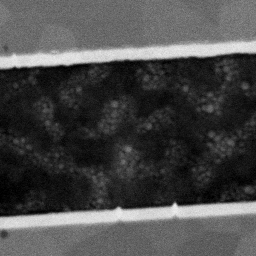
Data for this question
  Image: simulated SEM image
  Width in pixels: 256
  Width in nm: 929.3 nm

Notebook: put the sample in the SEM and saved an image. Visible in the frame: one or a few lines or trenches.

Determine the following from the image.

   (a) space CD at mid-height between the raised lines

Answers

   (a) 161 pixels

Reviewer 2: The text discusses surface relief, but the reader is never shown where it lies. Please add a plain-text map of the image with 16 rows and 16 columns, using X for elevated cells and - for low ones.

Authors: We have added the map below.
XXXXXXXXXXXXXXXX
XXXXXXXXXXXXXXXX
XXXXXXXXXXXXXXXX
XXXXXX----------
----------------
----------------
----------------
----------------
----------------
----------------
----------------
----------------
----------------
-------XXXXXXXXX
XXXXXXXXXXXXXXXX
XXXXXXXXXXXXXXXX